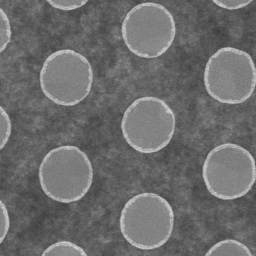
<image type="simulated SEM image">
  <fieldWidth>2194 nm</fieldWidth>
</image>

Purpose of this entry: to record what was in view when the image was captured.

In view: raised bodies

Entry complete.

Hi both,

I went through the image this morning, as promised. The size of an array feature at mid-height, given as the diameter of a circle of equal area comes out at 459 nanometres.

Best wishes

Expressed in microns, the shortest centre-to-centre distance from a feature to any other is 0.811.